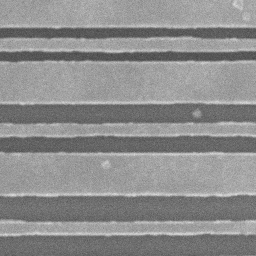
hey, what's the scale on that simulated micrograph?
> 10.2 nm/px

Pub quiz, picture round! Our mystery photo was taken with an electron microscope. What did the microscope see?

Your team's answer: lines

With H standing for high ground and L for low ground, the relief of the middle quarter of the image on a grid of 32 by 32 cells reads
HHHHHHHHHHHHHHHHHHHHHHHHHHHHHHHH
HHHHHHHHHHHHHHHHHHHHHHHHHHHHHHHH
HHHHHHHHHHHHHHHHHHHHHHHHHHHHHHHH
HHHHHHHHHHHHHHHHHHHHHHHHHHHHHHHH
HHHHHHHHHHHHHHHHHHHHHHHHHHHHHHHH
HHHHHHHHHHHHHHHHHHHHHHHHHHHHHHHH
HHHHHHHHHHHHHHHHHHHHHHHHHHHHHHHH
HHHHHHHHHHHHHHHHHHHHHHHHHHHHHHHH
HHHHHHHHHHHHHHHHHHHHHHHHHHHHHHHH
HHHHHHHHHHHHHHHHHHHHHHHHHHHHHHHH
LLLLLLLLLLLLLLLLLLLLLLLLLLLLLLLL
LLLLLLLLLLLLLLLLLLLLLLLLLLLLLLLL
LLLLLLLLLLLLLLLLLLLLLLLLLLLLLLLL
LLLLLLLLLLLLLLLLLLLLLLLLLLLLLLLL
LLLLLLLLLLLLLLLLLLLLLLLLLLLLLLLL
HHHHHHHHHHHHHHHHHHHHHHHHHHHHHHHH
HHHHHHHHHHHHHHHHHHHHHHHHHHHHHHHH
HHHHHHHHHHHHHHHHHHHHHHHHHHHHHHHH
LLLLLLLLLLLLLLLLLLLLLLLLLLLLLLLL
LLLLLLLLLLLLLLLLLLLLLLLLLLLLLLLL
LLLLLLLLLLLLLLLLLLLLLLLLLLLLLLLL
LLLLLLLLLLLLLLLLLLLLLLLLLLLLLLLL
HHHHHHHHHHHHHHHHHHHHHHHHHHHLHHHH
HHHHHHHHHHHHHHHHHHHHHHHHHHHHHHHH
HHHHHHHHHHHHHHHHHHHHHHHHHHHHHHHH
HHHHHHHHHHHHHHHHHHHHHHHHHHHHHHHH
HHHHHHHHHHHHHHHHHHHHHHHHHHHHHHHH
HHHHHHHHHHHHHHHHHHHHHHHHHHHHHHHH
HHHHHHHHHHHHHHHHHHHHHHHHHHHHHHHH
HHHHHHHHHHHHHHHHHHHHHHHHHHHHHHHH
HHHHHHHHHHHHHHHHHHHHHHHHHHHHHHHH
HHHHHHHHHHHHHHHHHHHHHHHHHHHHHHHH